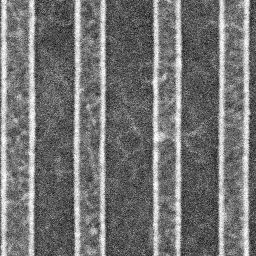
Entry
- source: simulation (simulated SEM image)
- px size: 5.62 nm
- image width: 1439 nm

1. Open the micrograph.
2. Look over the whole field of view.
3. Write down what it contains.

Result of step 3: one or a few lines or trenches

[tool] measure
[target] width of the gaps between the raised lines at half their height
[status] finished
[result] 252 nm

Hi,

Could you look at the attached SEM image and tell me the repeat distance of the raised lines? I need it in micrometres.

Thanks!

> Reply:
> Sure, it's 0.406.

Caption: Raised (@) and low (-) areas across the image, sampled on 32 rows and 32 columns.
-@@@------@@@------@@@------@@@-
-@@@------@@@------@@@------@@@-
-@@@------@@@------@@@------@@@-
-@@@------@@@------@@@------@@@-
-@@@------@@@------@@@------@@@-
-@@@------@@@-------@@------@@@-
-@@@------@@@-------@@------@@@-
-@@@------@@@-------@@------@@@-
-@@@------@@@------@@@------@@@-
-@@@------@@@------@@@------@@@-
-@@@------@@@------@@@------@@@-
-@@@------@@@------@@@------@@@-
-@@@------@@@------@@@------@@@-
-@@@------@@@------@@@------@@@-
-@@@------@@@------@@@------@@@-
@@@@------@@@------@@@------@@@-
@@@@------@@@------@@@------@@@-
@@@@------@@@------@@@------@@@-
@@@@------@@@------@@@------@@@-
@@@@------@@@------@@@------@@@-
@@@@------@@@------@@@------@@@-
@@@@------@@@------@@@------@@@-
@@@@------@@@------@@@------@@@-
@@@@------@@@------@@@------@@@-
-@@@------@@@------@@@------@@@-
-@@@------@@@------@@@------@@@-
-@@@------@@@------@@@------@@@-
-@@@------@@@------@@@------@@@-
-@@@------@@@------@@@------@@@-
-@@@------@@@------@@@------@@@-
-@@@------@@@------@@@------@@@-
-@@@------@@@------@@@------@@@-